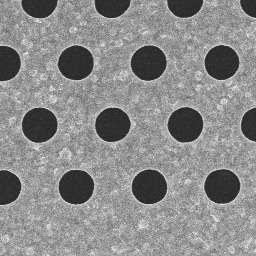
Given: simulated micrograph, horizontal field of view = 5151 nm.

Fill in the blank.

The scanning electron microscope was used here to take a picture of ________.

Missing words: a regular array of holes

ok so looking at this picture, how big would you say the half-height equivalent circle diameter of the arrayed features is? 0.716 µm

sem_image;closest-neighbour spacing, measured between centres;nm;1450